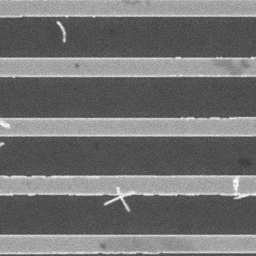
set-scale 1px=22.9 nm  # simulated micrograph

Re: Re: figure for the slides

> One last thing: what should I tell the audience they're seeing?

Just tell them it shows lines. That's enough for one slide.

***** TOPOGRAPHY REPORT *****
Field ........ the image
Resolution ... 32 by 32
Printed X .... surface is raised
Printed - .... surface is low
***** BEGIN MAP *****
XXXXXXXXXXXXXXXXXXXXXXXXXXXXXXXX
XXXXXXXXXXXXXXXXXXXXXXXXXXXXXXXX
--------------------------------
--------------------------------
--------------------------------
--------------------------------
--------------------------------
XXXXXXXXXXXXXXXXXXXXXXXXXXXXXXXX
XXXXXXXXXXXXXXXXXXXXXXXXXXXXXXXX
XXXXXXXXXXXXXXXXXXXXXXXXXXXXXXXX
--------------------------------
--------------------------------
--------------------------------
--------------------------------
--------------------------------
XXXXXXXXXXXXXXXXXXXXXXXXXXXXXXXX
XXXXXXXXXXXXXXXXXXXXXXXXXXXXXXXX
--------------------------------
--------------------------------
--------------------------------
--------------------------------
--------------------------------
XXXXXXXXXXXXXXXXXXXXXXXXXXXXXXXX
XXXXXXXXXXXXXXXXXXXXXXXXXXXXXXXX
---------------X----------------
--------------------------------
--------------------------------
--------------------------------
--------------------------------
XXXXXXXXXXXXXXXXXXXXXXXXXXXXXXXX
XXXXXXXXXXXXXXXXXXXXXXXXXXXXXXXX
XXXXXXXXXXXXXXXXXXXXXXXXXXXXXXXX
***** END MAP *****